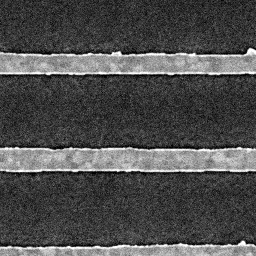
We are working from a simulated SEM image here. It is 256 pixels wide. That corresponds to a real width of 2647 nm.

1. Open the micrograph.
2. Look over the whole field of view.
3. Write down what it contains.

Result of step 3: lines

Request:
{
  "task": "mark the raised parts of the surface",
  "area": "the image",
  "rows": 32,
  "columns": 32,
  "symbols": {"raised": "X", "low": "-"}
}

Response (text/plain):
--------------------------------
--------------------------------
--------------------------------
--------------------------------
--------------------------------
--------------------------------
-------------------------------X
XXXXXXXXXXXXXXXXXXXXXXXXXXXXXXXX
XXXXXXXXXXXXXXXXXXXXXXXXXXXXXXXX
--------------------------------
--------------------------------
--------------------------------
--------------------------------
--------------------------------
--------------------------------
--------------------------------
--------------------------------
--------------------------------
--------------------------------
XXXXXXXXXXXXXXXXXXXXXXXXXXXXXXXX
XXXXXXXXXXXXXXXXXXXXXXXXXXXXXXXX
--------------------------------
--------------------------------
--------------------------------
--------------------------------
--------------------------------
--------------------------------
--------------------------------
--------------------------------
--------------------------------
------------------------------X-
XXXXXXXXXXXXXXXXXXXXXXXXXXXXXXXX